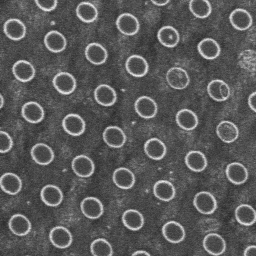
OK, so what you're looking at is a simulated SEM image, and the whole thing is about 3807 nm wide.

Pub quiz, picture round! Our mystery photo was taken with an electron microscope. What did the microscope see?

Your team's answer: a regular array of raised bodies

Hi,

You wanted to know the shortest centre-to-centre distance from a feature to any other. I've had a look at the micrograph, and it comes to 630 nm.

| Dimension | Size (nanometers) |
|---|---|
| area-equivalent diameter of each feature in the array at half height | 301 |